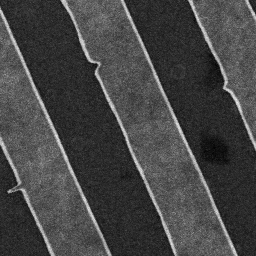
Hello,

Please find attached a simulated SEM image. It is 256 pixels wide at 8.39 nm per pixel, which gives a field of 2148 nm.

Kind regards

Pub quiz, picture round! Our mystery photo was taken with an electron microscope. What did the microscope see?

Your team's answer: one or a few lines or trenches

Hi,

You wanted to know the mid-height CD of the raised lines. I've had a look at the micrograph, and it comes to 448 nanometres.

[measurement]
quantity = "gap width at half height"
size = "520 nanometers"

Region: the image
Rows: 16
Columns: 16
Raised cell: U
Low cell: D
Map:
DDDDUUUUDDDDUUUU
DDDDDUUUDDDDUUUU
UDDDDUUUUDDDDUUU
UDDDDUUUUDDDDUUU
UUDDDDUUUUDDDDUU
UUDDDDUUUUDDDDUU
UUUDDDDUUUUDDDDU
UUUDDDDUUUUDDDDU
UUUUDDDDUUUDDDDD
UUUUDDDDUUUUDDDD
DUUUDDDDDUUUDDDD
DUUUUDDDDUUUUDDD
DDUUUDDDDDUUUDDD
DDUUUUDDDDUUUUDD
DDDUUUDDDDUUUUDD
DDDUUUUDDDDUUUUD